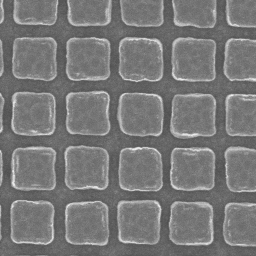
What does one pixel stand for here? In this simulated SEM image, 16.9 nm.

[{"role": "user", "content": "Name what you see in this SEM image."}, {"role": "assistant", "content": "a regular array of raised bodies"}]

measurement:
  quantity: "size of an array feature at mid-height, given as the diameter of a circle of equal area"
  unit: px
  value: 47.3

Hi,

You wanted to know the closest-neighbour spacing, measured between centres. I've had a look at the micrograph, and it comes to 52.7 pixels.